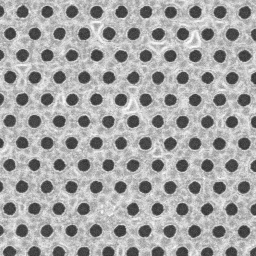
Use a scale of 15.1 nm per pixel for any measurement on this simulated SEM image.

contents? a regular array of holes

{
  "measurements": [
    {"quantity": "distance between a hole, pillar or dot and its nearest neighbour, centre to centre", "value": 371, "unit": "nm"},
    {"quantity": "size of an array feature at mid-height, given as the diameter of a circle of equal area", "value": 13.2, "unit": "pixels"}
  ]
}